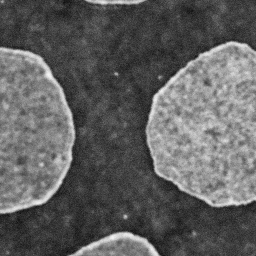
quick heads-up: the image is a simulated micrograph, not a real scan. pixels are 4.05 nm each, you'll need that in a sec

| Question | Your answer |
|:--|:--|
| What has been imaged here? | raised bodies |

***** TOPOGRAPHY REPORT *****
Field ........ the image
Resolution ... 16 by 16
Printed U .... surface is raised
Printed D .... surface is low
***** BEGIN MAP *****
DDDDDDDDDDDDDDDD
DDDDDDDDDDDDDDDD
DDDDDDDDDDDDDDDD
UUDDDDDDDDDDDUUU
UUUDDDDDDDDUUUUU
UUUUDDDDDDUUUUUU
UUUUDDDDDDUUUUUU
UUUUDDDDDUUUUUUU
UUUUUDDDDUUUUUUU
UUUUDDDDDUUUUUUU
UUUUDDDDDDUUUUUU
UUUUDDDDDDDUUUUU
UUUDDDDDDDDDDUUU
DDDDDDDDDDDDDDDD
DDDDDDDDDDDDDDDD
DDDDDUUUUDDDDDDD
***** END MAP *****